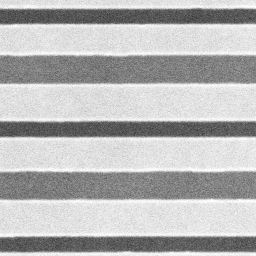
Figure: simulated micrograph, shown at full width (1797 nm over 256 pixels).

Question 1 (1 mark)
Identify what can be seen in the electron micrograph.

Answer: lines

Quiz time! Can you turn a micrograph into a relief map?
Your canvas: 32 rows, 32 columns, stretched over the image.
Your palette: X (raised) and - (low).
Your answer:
XXXXXXXXXXXXXXXXXXXXXXXXXXXXXXXX
--------------------------------
--------------------------------
XXXXXXXXXXXXXXXXXXXXXXXXXXXXXXXX
XXXXXXXXXXXXXXXXXXXXXXXXXXXXXXXX
XXXXXXXXXXXXXXXXXXXXXXXXXXXXXXXX
XXXXXXXXXXXXXXXXXXXXXXXXXXXXXXXX
--------------------------------
--------------------------------
--------------------------------
--------------------------------
XXXXXXXXXXXXXXXXXXXXXXXXXXXXXXXX
XXXXXXXXXXXXXXXXXXXXXXXXXXXXXXXX
XXXXXXXXXXXXXXXXXXXXXXXXXXXXXXXX
XXXXXXXXXXXXXXXXXXXXXXXXXXXXXXXX
--------------------------------
--------------------------------
XXXXXXXXXXXXXXXXXXXXXXXXXXXXXXXX
XXXXXXXXXXXXXXXXXXXXXXXXXXXXXXXX
XXXXXXXXXXXXXXXXXXXXXXXXXXXXXXXX
XXXXXXXXXXXXXXXXXXXXXXXXXXXXXXXX
--------------------------------
--------------------------------
--------------------------------
--------------------------------
XXXXXXXXXXXXXXXXXXXXXXXXXXXXXXXX
XXXXXXXXXXXXXXXXXXXXXXXXXXXXXXXX
XXXXXXXXXXXXXXXXXXXXXXXXXXXXXXXX
XXXXXXXXXXXXXXXXXXXXXXXXXXXXXXXX
--------------------------------
--------------------------------
--------------------------------